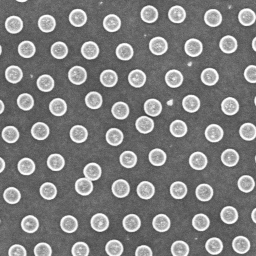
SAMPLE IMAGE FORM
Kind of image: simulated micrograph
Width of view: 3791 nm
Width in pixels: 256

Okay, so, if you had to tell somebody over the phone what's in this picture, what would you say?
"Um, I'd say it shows a regular array of raised bodies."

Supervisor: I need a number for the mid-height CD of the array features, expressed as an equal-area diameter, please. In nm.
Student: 243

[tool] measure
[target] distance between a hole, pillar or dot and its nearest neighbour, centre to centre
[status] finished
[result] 0.432 micrometres